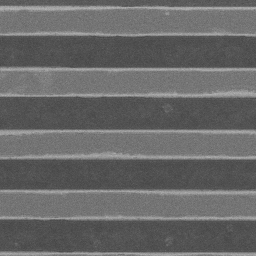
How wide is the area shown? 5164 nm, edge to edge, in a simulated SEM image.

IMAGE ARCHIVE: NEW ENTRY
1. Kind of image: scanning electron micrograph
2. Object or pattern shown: lines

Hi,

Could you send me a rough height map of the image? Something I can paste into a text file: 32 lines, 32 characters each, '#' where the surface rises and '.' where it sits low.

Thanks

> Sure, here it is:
................................
################################
################################
################################
................................
................................
................................
................................
................................
################################
################################
################################
................................
................................
................................
................................
################################
################################
################################
################################
................................
................................
................................
................................
################################
################################
################################
................................
................................
................................
................................
................................